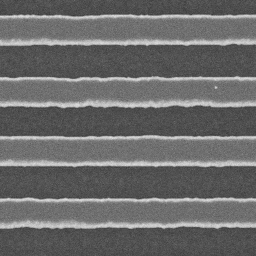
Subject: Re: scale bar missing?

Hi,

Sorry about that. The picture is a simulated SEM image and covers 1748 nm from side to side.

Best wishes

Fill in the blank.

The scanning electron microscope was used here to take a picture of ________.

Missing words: lines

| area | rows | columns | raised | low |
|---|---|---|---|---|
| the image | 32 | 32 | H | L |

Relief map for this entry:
LLLLLLLLLLLLLLLLLLLLLLLLLLLLLLLL
LLLLLLLLLLLLLLLLLLLLLLLLLLLLLLLL
HHHHHHHHHHHHHHHHHHHHHHHHHHHHHHHH
HHHHHHHHHHHHHHHHHHHHHHHHHHHHHHHH
HHHHHHHHHHHHHHHHHHHHHHHHHHHHHHHH
HHHHHHHHHHHHHHHHHHHHHHHHHHHHHLLH
LLLLLLLLLLLLLLLLLLLLLLLLLLLLLLLL
LLLLLLLLLLLLLLLLLLLLLLLLLLLLLLLL
LLLLLLLLLLLLLLLLLLLLLLLLLLLLLLLL
LLLLLLLLLLLLLLLLLLLLLLLLLLLLLLLL
HHHHHHHHHHHHHHHHHHHHHHHHHHHHHHHH
HHHHHHHHHHHHHHHHHHHHHHHHHHHHHHHH
HHHHHHHHHHHHHHHHHHHHHHHHHHHHHHHH
LLLLLLLLLLLLLLLLLLLLLLLLLLLLLLLL
LLLLLLLLLLLLLLLLLLLLLLLLLLLLLLLL
LLLLLLLLLLLLLLLLLLLLLLLLLLLLLLLL
LLLLLLLLLLLLLLLLLLLLLLLLLLLLLLLL
HHHHHHHHHHHHHHHHHHHHHHHHHHHHHHHH
HHHHHHHHHHHHHHHHHHHHHHHHHHHHHHHH
HHHHHHHHHHHHHHHHHHHHHHHHHHHHHHHH
HHHHHHHHHHHHHHHHHHHHHHHHHHHHHHHH
LLLLLLLLLLLLLLLLLLLLLLLLLLLLLLLL
LLLLLLLLLLLLLLLLLLLLLLLLLLLLLLLL
LLLLLLLLLLLLLLLLLLLLLLLLLLLLLLLL
LLLLLLLLLLLLLLLLLLLLLLLLLLLLLLLL
HHHHHHHHHHHHHHHHHHHHHHHHHHHHHHHH
HHHHHHHHHHHHHHHHHHHHHHHHHHHHHHHH
HHHHHHHHHHHHHHHHHHHHHHHHHHHHHHHH
HLLLLLLLLLHHLLLLHLLLLLLLLLLLLLLL
LLLLLLLLLLLLLLLLLLLLLLLLLLLLLLLL
LLLLLLLLLLLLLLLLLLLLLLLLLLLLLLLL
LLLLLLLLLLLLLLLLLLLLLLLLLLLLLLLL